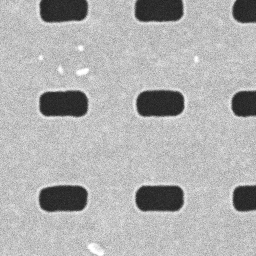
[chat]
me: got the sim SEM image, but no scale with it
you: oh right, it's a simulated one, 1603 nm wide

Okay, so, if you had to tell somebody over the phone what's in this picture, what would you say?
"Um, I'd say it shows holes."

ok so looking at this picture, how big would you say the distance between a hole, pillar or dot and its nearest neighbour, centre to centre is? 592 nm